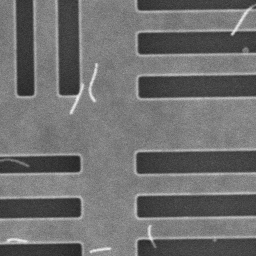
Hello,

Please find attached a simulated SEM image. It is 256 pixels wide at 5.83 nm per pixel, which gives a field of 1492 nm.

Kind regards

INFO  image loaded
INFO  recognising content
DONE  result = groups of lines, slits or small figures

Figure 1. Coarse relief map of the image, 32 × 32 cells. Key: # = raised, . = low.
##..###...#######...............
##..###...######################
##..###...######################
##..###...######################
##..###...#######...............
##..###...#######...............
##..###...#######...............
##..###...######################
##..###...######################
##..###...#########.............
##..###...#######...............
##..###...#######...............
################################
################################
################################
################################
################################
################################
################################
####......#######...............
..........#######...............
..........#######...............
################################
################################
##################..............
..........#######...............
..........#######...............
################################
################################
################################
..........#######...............
..........#######...............